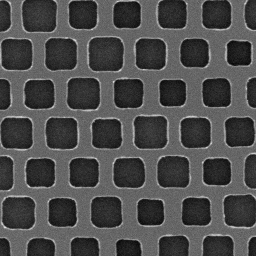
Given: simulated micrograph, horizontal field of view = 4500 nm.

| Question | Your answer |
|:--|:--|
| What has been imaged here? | a regular array of holes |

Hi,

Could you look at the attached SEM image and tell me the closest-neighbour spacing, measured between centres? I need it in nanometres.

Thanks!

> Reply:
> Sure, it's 774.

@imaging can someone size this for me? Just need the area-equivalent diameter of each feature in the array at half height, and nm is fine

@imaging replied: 578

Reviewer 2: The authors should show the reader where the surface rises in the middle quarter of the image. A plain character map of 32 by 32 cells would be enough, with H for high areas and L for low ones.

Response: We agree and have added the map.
LLLHHHLLLLLLLLLHHHLLLLLLLHHHHHLL
LLHHHHHLLLLLLLHHHHHHLLLLHHHHHHHH
HHHHHHHHHHHHHHHHHHHHHHHHHHHHHHHH
HHLLLLLLHHHHHHHHHHHHHHHHHHHHHHHH
HLLLLLLLLHHHHLLLLLLLHHHHLLLLLLHH
HLLLLLLLLHHHLLLLLLLLHHHHLLLLLLLH
HLLLLLLLLHHHLLLLLLLLHHHHLLLLLLLH
HLLLLLLLLHHHLLLLLLLLHHHHLLLLLLLH
HLLLLLLLLHHHLLLLLLLLHHHHLLLLLLLH
HLLLLLLLLHHHHLLLLLLLHHHHLLLLLLHH
HLLLLLLLLHHHHLLLLLLHHHHHHLLLLHHH
HHHHLLLLHHHHHHHHHHHHHHHHHHHHHHHH
HHHHHHHHHHHHHHHHHHHHHHHHHHHHHHHH
LLHHHHHHHHHLHHHHHHLLLLLLLHHHHHLL
LLLHHHHLLLLLLLHHHLLLLLLLLLHHHLLL
LLLLHHHLLLLLLLHHHLLLLLLLLLHHHLLL
LLLLHHHLLLLLLLLHHLLLLLLLLLHHHLLL
LLLLHHHLLLLLLLLHHHLLLLLLLLHHHLLL
LLLLHHHLLLLLLLLHHHLLLLLLLLHHHLLL
LLLLHHHLLLLLLLLHHLLLLLLLLLHHHLLL
LLLHHHHLLLLLLLHHHHLLLLLLLHHHHHLL
LLHHHHHHHHHHHHHHHHHHHHHHHHHHHHHH
HHHHHHHHHHHHHHHHHHHHHHHHHHHHHHHH
HHHLLLLHHHHHHHHLLLLHHHHHLLLLLLLH
HLLLLLLLLHHHHLLLLLLLHHHLLLLLLLLH
HLLLLLLLLHHHLLLLLLLLHHHLLLLLLLLH
HLLLLLLLLHHHLLLLLLLLHHHLLLLLLLLH
HLLLLLLLLHHHLLLLLLLLHHHLLLLLLLLH
HLLLLLLLLHHHLLLLLLLLHHHLLLLLLLLH
HLLLLLLLLHHHLLLLLLLLHHHLLLLLLLLH
HHLLLLLLHHHHHLLLLLLHHHHHLLLLLLLH
HHHHHHHHHHHHHHHHHHHHHHHHHHHHHHHH